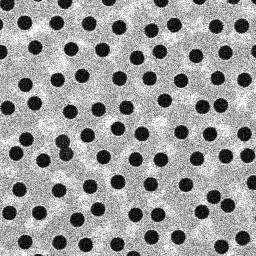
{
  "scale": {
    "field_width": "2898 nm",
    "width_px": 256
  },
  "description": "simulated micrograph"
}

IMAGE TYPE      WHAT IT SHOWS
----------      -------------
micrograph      a regular array of holes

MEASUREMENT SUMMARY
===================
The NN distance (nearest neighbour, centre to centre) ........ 288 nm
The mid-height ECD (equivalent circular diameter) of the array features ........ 168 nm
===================